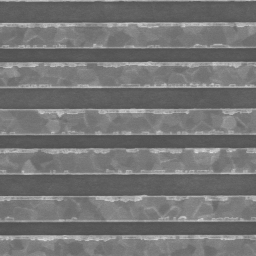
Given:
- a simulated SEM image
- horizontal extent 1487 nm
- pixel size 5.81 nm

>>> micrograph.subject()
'parallel lines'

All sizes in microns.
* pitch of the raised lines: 0.252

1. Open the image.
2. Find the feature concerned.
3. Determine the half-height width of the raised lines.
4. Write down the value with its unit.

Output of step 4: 149 nanometres